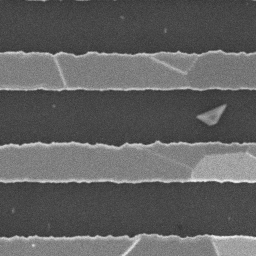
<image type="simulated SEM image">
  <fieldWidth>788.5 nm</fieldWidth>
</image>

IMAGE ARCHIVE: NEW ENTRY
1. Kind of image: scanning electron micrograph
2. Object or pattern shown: lines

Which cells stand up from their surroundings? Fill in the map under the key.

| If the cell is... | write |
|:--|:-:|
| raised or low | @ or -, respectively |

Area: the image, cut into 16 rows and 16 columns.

----------------
----------------
----------------
@@@@@@@@@@@@@@@@
@@@@@@@@@@@@@@@@
@@@@@@@@@@@@@@@@
----------------
----------------
----------------
@@@@@@@@@@@@@@@@
@@@@@@@@@@@@@@@@
----------------
----------------
----------------
----------------
@@@@@@@@@@@@@@@@